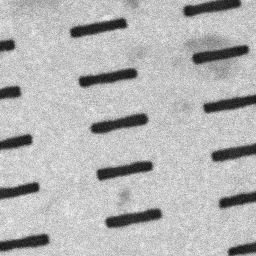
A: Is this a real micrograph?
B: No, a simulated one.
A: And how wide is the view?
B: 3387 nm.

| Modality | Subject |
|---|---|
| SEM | holes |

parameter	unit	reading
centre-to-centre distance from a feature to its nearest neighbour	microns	0.639